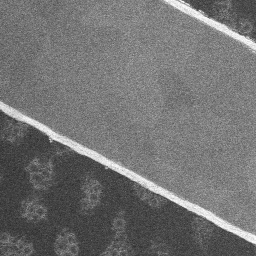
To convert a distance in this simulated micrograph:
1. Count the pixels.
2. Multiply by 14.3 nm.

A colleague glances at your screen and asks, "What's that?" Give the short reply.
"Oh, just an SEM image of one or a few lines or trenches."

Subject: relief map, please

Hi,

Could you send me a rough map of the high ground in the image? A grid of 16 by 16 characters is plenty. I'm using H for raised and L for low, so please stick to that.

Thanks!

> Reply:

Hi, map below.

HHHHHHHHHHHHLLLL
HHHHHHHHHHHHHLLL
HHHHHHHHHHHHHHHL
HHHHHHHHHHHHHHHH
HHHHHHHHHHHHHHHH
HHHHHHHHHHHHHHHH
HHHHHHHHHHHHHHHH
LLHHHHHHHHHHHHHH
LLLHHHHHHHHHHHHH
LLLLLHHHHHHHHHHH
LLLLLLLHHHHHHHHH
LLLLLLLLLHHHHHHH
LLLLLLLLLLLHHHHH
LLLLLLLLLLLLLHHH
LLLLLLLLLLLLLLLH
LLLLLLLLLLLLLLLL